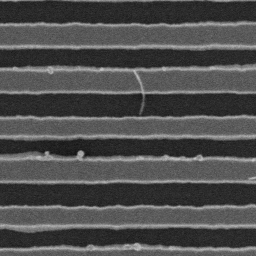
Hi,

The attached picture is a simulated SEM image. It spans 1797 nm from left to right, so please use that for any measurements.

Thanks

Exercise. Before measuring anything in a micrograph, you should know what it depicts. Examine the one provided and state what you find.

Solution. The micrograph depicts lines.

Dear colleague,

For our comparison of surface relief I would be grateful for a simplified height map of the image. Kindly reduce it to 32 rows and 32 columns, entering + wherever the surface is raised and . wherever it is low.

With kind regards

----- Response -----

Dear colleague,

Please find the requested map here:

................................
................................
................................
++++++++++++++++++++++++++++++++
++++++++++++++++++++++++++++++++
++++++++++++++++++++++++++++++++
................................
................................
.+++..++++++........++++++++++++
++++++++++++++++++++++++++++++++
++++++++++++++++++++++++++++++++
++++++++++++++++++++++++++++++++
................................
................................
..............................+.
++++++++++++++++++++++++++++++++
++++++++++++++++++++++++++++++++
................................
................................
...++++..++.....................
++++++++++++++++++++++++++++++++
++++++++++++++++++++++++++++++++
++++++++++++++++++++++++++++++++
................................
................................
................................
++++++++++++++++++++++++++++++++
++++++++++++++++++++++++++++++++
.+++++++......+.................
................................
................................
++++++++++++++++++++++++++++++++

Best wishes